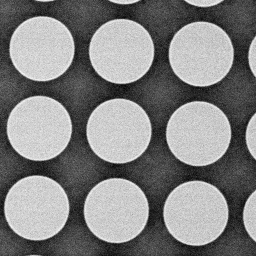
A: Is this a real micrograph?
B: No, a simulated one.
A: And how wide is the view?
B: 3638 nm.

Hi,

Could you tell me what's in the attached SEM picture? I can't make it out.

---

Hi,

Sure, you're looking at an array of small figures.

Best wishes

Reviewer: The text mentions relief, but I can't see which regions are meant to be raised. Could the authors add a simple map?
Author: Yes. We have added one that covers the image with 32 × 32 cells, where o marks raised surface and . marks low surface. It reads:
........................ooo.....
................................
....ooo.......oo................
..oooooo.....ooooo.....oooo.....
..ooooooo...ooooooo...oooooo....
.oooooooo..oooooooo..oooooooo..o
.oooooooo..oooooooo..oooooooo..o
..ooooooo..oooooooo..oooooooo..o
..oooooo....ooooooo...ooooooo..o
...oooo......ooooo....oooooo....
........................ooo.....
................................
...oooo.......oo................
..oooooo....oooooo.....oooo.....
.oooooooo..ooooooo....oooooo....
.oooooooo..oooooooo..oooooooo..o
.oooooooo..oooooooo..oooooooo..o
.oooooooo..oooooooo..oooooooo..o
..oooooo...ooooooo...ooooooo...o
...oooo.....ooooo.....oooooo....
........................oo......
................................
...ooo.......ooo................
.ooooooo....ooooo.....ooooo.....
.ooooooo...ooooooo...ooooooo...o
.oooooooo..ooooooo...ooooooo...o
.oooooooo..ooooooo...ooooooo..oo
.ooooooo...ooooooo...ooooooo..oo
..oooooo...ooooooo...ooooooo...o
...ooo......ooooo.....ooooo....o
........................oo......
................................